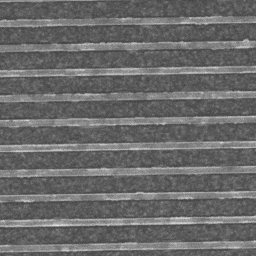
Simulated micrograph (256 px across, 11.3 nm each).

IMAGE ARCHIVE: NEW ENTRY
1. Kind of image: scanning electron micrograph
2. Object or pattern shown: parallel lines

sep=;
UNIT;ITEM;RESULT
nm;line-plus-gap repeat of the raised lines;282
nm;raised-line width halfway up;71.8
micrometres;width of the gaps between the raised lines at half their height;0.215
